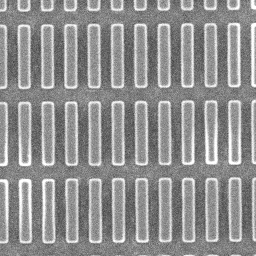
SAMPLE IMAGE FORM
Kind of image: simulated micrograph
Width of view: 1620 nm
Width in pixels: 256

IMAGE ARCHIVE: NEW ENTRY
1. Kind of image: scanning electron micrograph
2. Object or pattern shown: groups of lines, slits or small figures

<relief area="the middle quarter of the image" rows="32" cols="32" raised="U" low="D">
UUUDDDUUUDDDUUUDDDUUUDDDUUDDDDUU
UUUDDDUUUDDDUUUDDDUUUDDDUUDDDDUU
UUUDDDUUUDDDUUUDDDUUUDDDUUDDDDUU
UUUDDDUUUDDDUUUDDDUUUDDDUUDDDDUU
UUUDDDUUUDDDUUUDDDUUUDDDUUDDDDUU
UUUDDDUUUDDDUUUDDDUUUDDDUUDDDDUU
DDDDDDDDDDDDDDDDDDDDDDDDDDDDDDDD
DDDDDDDDDDDDDDDDDDDDDDDDDDDDDDDD
DDDDDDDDDDDDDDDDDDDDDDDDDDDDDDDD
DDDDDDDUUDDDUUDDDDUUDDDDUUDDDDUU
DUUDDDUUUDDDUUUDDDUUUDDDUUDDDDUU
DUUDDDUUUDDDUUUDDDUUUDDDUUDDDDUU
DUUDDDUUUDDDUUUDDDUUUDDDUUUDDDUU
DUUDDDUUUDDDUUUDDDUUUDDDUUUDDDUU
DUUDDDUUUDDDUUUDDDUUUDDDUUUDDDUU
DUUDDDUUUDDDUUUDDDUUUDDDUUUDDDUU
DUUDDDUUUDDDUUUDDDUUUDDDUUUDDDUU
DUUDDDUUUDDDUUUDDDUUUDDDUUUDDDUU
DUUDDDUUUDDDUUUDDDUUUDDDUUUDDDUU
DUUDDDUUUDDDUUUDDDUUUDDDUUUDDDUU
DUUDDDUUUDDDUUUDDDUUUDDDUUUDDDUU
DUUDDDUUUDDDUUUDDDUUUDDDUUUDDDUU
DUUDDDUUUDDDUUUDDDUUUDDDUUUDDDUU
DUUDDDUUUDDDUUUDDDUUUDDDUUUDDDUU
DUUDDDUUUDDDUUUDDDUUUDDDUUUDDDUU
DDDDDDDDDDDDDDDDDDDDDDDDDDDDDDDD
DDDDDDDDDDDDDDDDDDDDDDDDDDDDDDDD
DDDDDDDDDDDDDDDDDDDDDDDDDDDDDDDD
DDDDDDDDDDDDDDDDDDDDDDDDDDDDDDDD
DUUDDDUUUDDDUUUDDDUUUDDDUUUDDDUU
DUUDDDUUUDDDUUUDDDUUUDDDUUUDDDUU
DUUDDDUUUDDDUUUDDDUUUDDDUUUDDDUU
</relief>